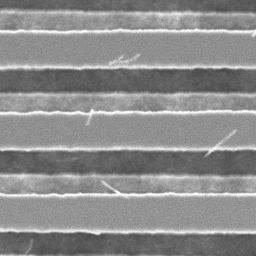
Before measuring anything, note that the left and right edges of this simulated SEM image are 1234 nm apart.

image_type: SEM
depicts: lines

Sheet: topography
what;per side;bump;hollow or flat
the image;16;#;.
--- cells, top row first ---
................
################
################
################
................
................
################
################
################
................
................
################
################
################
.###############
................